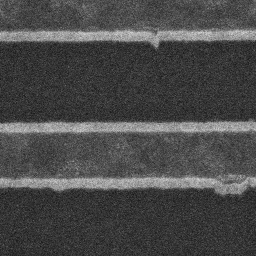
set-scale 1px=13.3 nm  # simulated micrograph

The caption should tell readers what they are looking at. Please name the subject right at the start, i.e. one or a few lines or trenches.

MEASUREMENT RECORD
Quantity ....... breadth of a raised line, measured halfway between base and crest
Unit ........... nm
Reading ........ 739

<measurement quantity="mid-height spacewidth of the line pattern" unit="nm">1220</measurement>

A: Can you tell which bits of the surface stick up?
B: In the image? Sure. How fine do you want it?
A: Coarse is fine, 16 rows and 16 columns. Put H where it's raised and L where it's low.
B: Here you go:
HHHHHHHHHHHHHHHH
HHHHHHHHHHHHHHHH
LLLLLLLLLLLLLLLL
LLLLLLLLLLLLLLLL
LLLLLLLLLLLLLLLL
LLLLLLLLLLLLLLLL
LLLLLLLLLLLLLLLL
LLLLLLLLLLLLLLLL
HHHHHHHHHHHHHHHH
HHHHHHHHHHHHHHHH
HHHHHHHHHHHHHHHH
LLLLLLLLLLLLLHHL
LLLLLLLLLLLLLLLL
LLLLLLLLLLLLLLLL
LLLLLLLLLLLLLLLL
LLLLLLLLLLLLLLLL